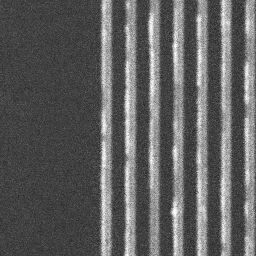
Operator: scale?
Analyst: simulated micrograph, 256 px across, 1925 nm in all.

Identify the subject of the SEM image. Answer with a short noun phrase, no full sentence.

parallel lines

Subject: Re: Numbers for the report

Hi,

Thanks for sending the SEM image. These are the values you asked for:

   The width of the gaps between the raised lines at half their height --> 15.6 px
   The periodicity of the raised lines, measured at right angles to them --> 179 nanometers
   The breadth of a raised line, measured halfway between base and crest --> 8.12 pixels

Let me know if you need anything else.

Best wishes